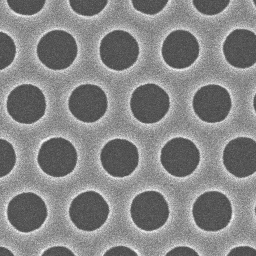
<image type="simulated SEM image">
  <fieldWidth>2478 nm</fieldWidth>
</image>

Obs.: a regular array of holes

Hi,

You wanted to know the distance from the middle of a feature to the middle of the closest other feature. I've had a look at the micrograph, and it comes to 594 nm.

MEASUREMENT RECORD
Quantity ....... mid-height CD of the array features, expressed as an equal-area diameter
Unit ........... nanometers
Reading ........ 387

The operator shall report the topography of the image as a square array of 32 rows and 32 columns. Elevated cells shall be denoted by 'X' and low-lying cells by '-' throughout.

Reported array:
X-----XXX----XXXX----XXX-----XXX
XX---XXXX----XXXXX--XXXXX---XXXX
XXXXXXXXXXXXXXXXXXXXXXXXXXXXXXXX
XXXXXXXXXXXXXXXXXXXXXXXXXXXXXXXX
-XXXX----XXXX----XXXX---XXXX----
--XXX-----XXX----XXX-----XXX----
--XXX-----XX-----XXX-----XXX----
--XXX----XXXX----XXXX---XXXX----
-XXXXX--XXXXXX--XXXXXX-XXXXXXXXX
XXXXXXXXXXXXXXXXXXXXXXXXXXXXXXXX
XXXXXXXXXXXXXXXXXX-XXXXXXXXXXXXX
X----XXXX----XXXX----XXXX---XXXX
X-----XXX----XXX-----XXX-----XXX
X-----XXX----XXX-----XXX-----XXX
X----XXXX----XXXX----XXXX---XXXX
XXXXXXXXXXXXXXXXXXXXXXXXXXXXXXXX
XXXXXXXXXXXXXXXXXXXXXXXXXXXXXXXX
-XXXXX--XXXXXX--XXXXX---XXXXX---
--XXX----XXXX----XXX-----XXX----
--XXX-----XXX----XXX-----XXX----
--XXX-----XXX----XXX-----XXX----
-XXXXX---XXXX----XXXX---XXXXX---
XXXXXXXXXXXXXXXXXXXXXXXXXXXXXXXX
XXXXXXXXXXXXXXXXXXXXXXXXXXXXXXXX
XX---XXXXX---XXXX---XXXXX---XXXX
X-----XXX----XXX-----XXX-----XXX
X-----XXX-----XX-----XXX-----XXX
X-----XXX----XXXX----XXX-----XXX
XX---XXXXX--XXXXX---XXXXX---XXXX
XXXXXXXXXXXXXXXXXXXXXXXXXXXXXXXX
XXXXXXXXXXXXXXXXXXXXXXXXXXXXXXXX
-XXXXX---XXXX----XXXX----XXXX---